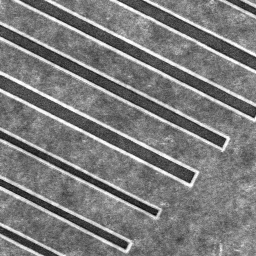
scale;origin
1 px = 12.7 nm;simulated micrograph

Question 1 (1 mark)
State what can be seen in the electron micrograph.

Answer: parallel lines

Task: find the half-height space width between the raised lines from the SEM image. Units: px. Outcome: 13.2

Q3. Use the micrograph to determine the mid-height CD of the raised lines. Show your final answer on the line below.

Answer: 403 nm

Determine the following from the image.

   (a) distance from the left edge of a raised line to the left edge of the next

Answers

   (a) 563 nm